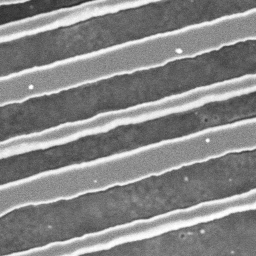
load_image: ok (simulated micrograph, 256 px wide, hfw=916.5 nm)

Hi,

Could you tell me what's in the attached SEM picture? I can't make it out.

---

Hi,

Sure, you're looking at lines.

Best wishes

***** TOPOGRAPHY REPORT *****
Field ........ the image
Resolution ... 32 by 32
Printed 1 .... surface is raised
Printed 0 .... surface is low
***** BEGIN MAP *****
11000000001111111100000000000000
00000011111110000000000000000001
00011111110000000000000000011111
11111110000000000000000111111111
11100000000000000001111111111111
00000000000000011111111111111000
00000000000011111111111111000000
00000000111111111111110000000000
00001111111111111110000000000000
01111111111111000000000000000011
11111111111000000000000000011111
11111110000000000000000111111110
11100000000000000000111111100000
00000000000000001111111100000000
00000000000011111111000000000000
00000000111111100000000000000111
00000111111110000000000001111111
01111111100000000000011111111111
11111000000000000111111111111111
10000000000000111111111111110000
00000000001111111111111100000000
00000011111111111111100000000000
00111111111111111000000000000000
11111111111111000000000000000000
11111111110000000000000000000111
11111000000000000000000001111111
10000000000000000000011111111000
00000000000000000011111111000000
00000000000000111111110000000000
00000000001111111110000000000000
00000011111111100000000000000000
00011111111000000000000000000000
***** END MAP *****